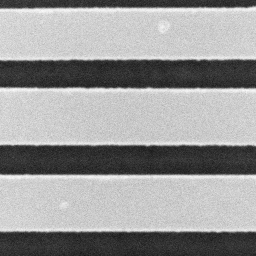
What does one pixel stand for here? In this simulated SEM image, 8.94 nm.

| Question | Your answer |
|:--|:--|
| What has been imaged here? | lines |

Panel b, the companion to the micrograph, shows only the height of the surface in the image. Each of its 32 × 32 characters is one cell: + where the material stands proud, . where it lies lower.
................................
++++++++++++++++++++++++++++++++
++++++++++++++++++++++++++++++++
++++++++++++++++++++++++++++++++
++++++++++++++++++++++++++++++++
++++++++++++++++++++++++++++++++
++++++++++++++++++++++++++++++++
................................
................................
................................
................................
++++++++++++++++++++++++++++++++
++++++++++++++++++++++++++++++++
++++++++++++++++++++++++++++++++
++++++++++++++++++++++++++++++++
++++++++++++++++++++++++++++++++
++++++++++++++++++++++++++++++++
++++++++++++++++++++++++++++++++
................................
................................
................................
................................
++++++++++++++++++++++++++++++++
++++++++++++++++++++++++++++++++
++++++++++++++++++++++++++++++++
++++++++++++++++++++++++++++++++
++++++++++++++++++++++++++++++++
++++++++++++++++++++++++++++++++
++++++++++++++++++++++++++++++++
................................
................................
................................